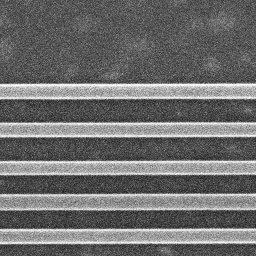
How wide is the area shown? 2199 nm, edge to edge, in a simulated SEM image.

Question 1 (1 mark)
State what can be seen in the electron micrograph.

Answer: parallel lines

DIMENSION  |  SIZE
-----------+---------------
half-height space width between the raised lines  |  193 nm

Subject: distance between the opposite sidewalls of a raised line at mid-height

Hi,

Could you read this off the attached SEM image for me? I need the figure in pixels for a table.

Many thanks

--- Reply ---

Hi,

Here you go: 13.2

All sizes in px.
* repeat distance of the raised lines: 36.3